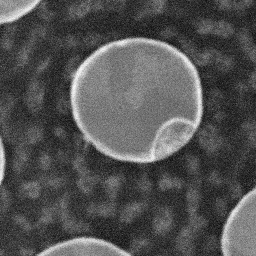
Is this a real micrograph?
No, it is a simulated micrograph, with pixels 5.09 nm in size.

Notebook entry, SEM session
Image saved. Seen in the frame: raised bodies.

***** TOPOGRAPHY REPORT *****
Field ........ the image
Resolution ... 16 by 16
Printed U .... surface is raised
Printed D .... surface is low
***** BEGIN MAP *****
UUDDDDDDDDDDDDDD
DDDDDDDDDDDDDDDD
DDDDDDDDUDDDDDDD
DDDDDDUUUUUDDDDD
DDDDDUUUUUUUDDDD
DDDDDUUUUUUUDDDD
DDDDDUUUUUUUUDDD
DDDDDUUUUUUUDDDD
DDDDDUUUUUDDDDDD
DDDDDDUUUUDDDDDD
DDDDDDDDDDDDDDDD
DDDDDDDDDDDDDDDD
DDDDDDDDDDDDDDDU
DDDDDDDDDDDDDDUU
DDDDDDDDDDDDDDUU
DDDUUUUDDDDDDDUU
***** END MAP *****